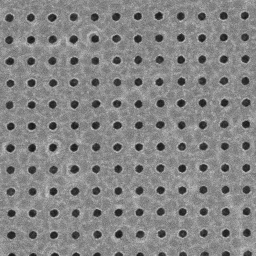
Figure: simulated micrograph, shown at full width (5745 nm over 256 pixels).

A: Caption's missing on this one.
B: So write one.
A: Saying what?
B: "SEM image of a regular array of holes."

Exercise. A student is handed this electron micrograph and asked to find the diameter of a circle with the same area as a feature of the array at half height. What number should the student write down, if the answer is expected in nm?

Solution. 188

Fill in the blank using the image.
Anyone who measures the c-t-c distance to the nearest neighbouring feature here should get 0.475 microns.